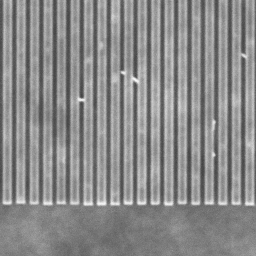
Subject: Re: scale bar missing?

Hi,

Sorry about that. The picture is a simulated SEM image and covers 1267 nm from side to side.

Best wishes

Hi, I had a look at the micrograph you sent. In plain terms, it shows parallel lines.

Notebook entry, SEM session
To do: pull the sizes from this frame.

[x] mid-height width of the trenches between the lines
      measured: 0.0285 µm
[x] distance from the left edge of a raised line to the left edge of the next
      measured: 66.8 nm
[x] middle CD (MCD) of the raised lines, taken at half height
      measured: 38.4 nm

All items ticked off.